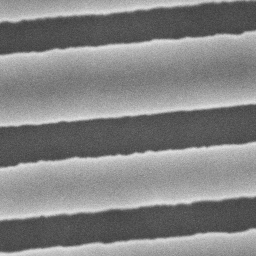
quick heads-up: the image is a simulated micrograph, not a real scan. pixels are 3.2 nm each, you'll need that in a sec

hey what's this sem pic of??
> lines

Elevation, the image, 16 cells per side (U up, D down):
UUUUUUUUUDDDDDDD
DDDDDDDDDDDDDDDD
DDDDDDDDDDUUUUUU
UUUUUUUUUUUUUUUU
UUUUUUUUUUUUUUUU
UUUUUUUUUUUUUUUU
UUUUUUUUUUUUUUUU
UUUUUDDDDDDDDDDD
DDDDDDDDDDDDDDDD
DDDDDDDDDDUUUUUU
UUUUUUUUUUUUUUUU
UUUUUUUUUUUUUUUU
UUUUUUUUUUUUUDDD
UUDDDDDDDDDDDDDD
DDDDDDDDDDDDDDDU
DDDUUUUUUUUUUUUU